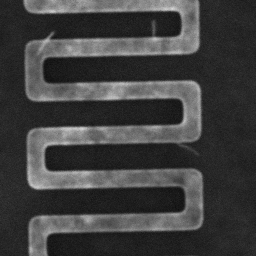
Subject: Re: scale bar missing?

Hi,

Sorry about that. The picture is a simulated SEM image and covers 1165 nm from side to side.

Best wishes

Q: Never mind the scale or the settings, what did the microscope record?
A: groups of lines, slits or small figures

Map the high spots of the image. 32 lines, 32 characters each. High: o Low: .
...oooooooooooooooooooooo.......
....oooo..............ooo.......
.......................oo.......
.......................oo.......
......................ooo.......
...oooooooooooooooooooooo.......
...ooooooooooooooooooooo........
...ooo..........................
...oo...........................
...oo...........................
...oooooooooooooooooooooo.......
...oooooooooooooooooooooo.......
....ooooo..............oo.......
.......................oo.......
.......................oo.......
......................ooo.......
....ooooooooooooooooooooo.......
...oooooooooooooooooooooo.......
...ooo..........................
...oo...........................
...ooo..........................
...oooo.ooooooooooooooooo.......
...oooooooooooooooooooooo.......
....ooooooo............oo.......
.......................oo.......
.......................oo.......
.......................oo.......
....ooooooooooooooooooooo.......
....ooooooooooooooooooooo.......
....oo..........................
....oo..........................
....oo..........................